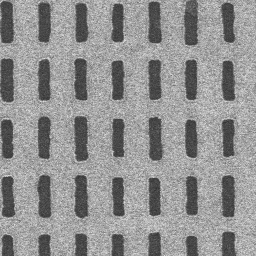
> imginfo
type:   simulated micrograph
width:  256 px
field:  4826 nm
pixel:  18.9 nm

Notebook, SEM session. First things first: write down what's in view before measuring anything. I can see a regular array of holes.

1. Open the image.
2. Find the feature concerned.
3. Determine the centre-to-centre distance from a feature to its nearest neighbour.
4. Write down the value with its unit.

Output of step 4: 691 nanometres